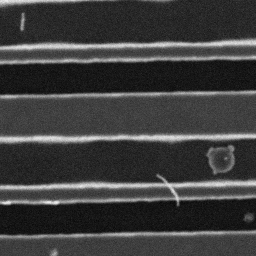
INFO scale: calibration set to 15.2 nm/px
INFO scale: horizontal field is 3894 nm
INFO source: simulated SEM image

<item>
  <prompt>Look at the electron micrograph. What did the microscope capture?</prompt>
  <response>lines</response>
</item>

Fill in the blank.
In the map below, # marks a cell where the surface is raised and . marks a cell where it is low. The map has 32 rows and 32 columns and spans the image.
................................
................................
................................
................................
................................
.............................###
################################
###################.............
................................
................................
................................
................................
################################
################################
################################
################################
################################
................................
................................
................................
................................
................................
................................
################################
################################
................................
................................
................................
................................
..#.############################
################################
################################